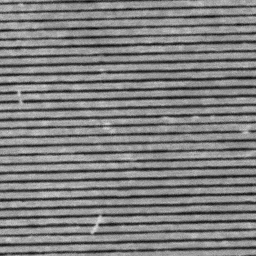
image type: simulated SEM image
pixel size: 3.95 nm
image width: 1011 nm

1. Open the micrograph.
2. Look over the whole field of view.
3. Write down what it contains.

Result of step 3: parallel lines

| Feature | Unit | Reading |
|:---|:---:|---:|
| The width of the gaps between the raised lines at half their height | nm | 11.9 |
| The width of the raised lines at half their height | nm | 23.7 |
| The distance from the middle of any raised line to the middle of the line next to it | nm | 35.4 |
